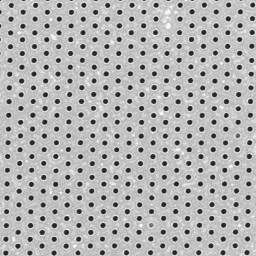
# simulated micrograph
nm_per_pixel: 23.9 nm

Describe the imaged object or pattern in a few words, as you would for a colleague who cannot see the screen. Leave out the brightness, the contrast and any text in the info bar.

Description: a regular array of holes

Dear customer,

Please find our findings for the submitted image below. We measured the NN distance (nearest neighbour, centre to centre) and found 325 nm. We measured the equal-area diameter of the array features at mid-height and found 132 nm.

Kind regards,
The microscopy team